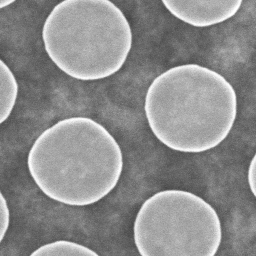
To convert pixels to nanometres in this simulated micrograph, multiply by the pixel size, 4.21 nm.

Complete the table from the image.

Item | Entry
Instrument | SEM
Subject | raised bodies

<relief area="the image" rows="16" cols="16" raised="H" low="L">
LLLLHHHLLLLHHHHL
LLLHHHHHLLLLHLLL
LLLHHHHHLLLLLLLL
LLLHHHHHLLLLLLLL
HLLLHHHLLLHHHLLL
HLLLLLLLLHHHHHLL
HLLLLLLLLHHHHHHL
LLLLHLLLLHHHHHHL
LLLHHHHLLLHHHHLL
LLHHHHHHLLLLLLLL
LLHHHHHHLLLLLLLL
LLHHHHHLLLLLLLLL
LLLLHHLLLHHHHLLL
LLLLLLLLLHHHHHLL
LLLLLLLLHHHHHHLL
LLLHHLLLLHHHHHLL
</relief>